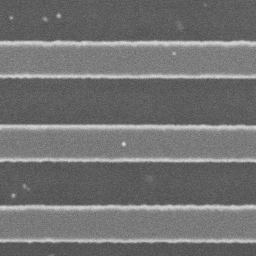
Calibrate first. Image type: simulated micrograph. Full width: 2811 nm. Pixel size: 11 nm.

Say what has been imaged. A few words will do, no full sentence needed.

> lines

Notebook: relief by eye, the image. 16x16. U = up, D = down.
DDDDDDDDDDDDDDDD
DDDDDDDDDDDDDDDD
DDDDDDDDDDDDDDDD
UUUUUUUUUUUUUUUU
UUUUUUUUUUUUUUUU
DDDDDDDDDDDDDDDD
DDDDDDDDDDDDDDDD
DDDDDDDDDDDDDDDD
UUUUUUUUUUUUUUUU
UUUUUUUUUUUUUUUU
DDDDDDDDDDDDDDDD
DDDDDDDDDDDDDDDD
DDDDDDDDDDDDDDDD
UUUUUUUUUUUUUUUU
UUUUUUUUUUUUUUUU
DDDDDDDDDDDDDDDD